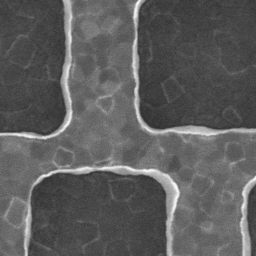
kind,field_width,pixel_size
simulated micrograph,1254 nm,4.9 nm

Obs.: holes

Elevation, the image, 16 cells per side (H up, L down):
LLLLHHHHHLLLLLLL
LLLLHHHHHLLLLLLL
LLLLHHHHHLLLLLLL
LLLLHHHHHLLLLLLL
LLLLHHHHHLLLLLLL
LLLLHHHHHLLLLLLL
LLLLHHHHHLLLLLLL
LLLLHHHHHLLLLLLL
HHHHHHHHHHHHHHHH
HHHHHHHHHHHHHHHH
HHHHHHHHHHHHHHHH
HHLLLLLLLLHHHHHH
HHLLLLLLLLLHHHHL
HHLLLLLLLLLHHHHL
HHLLLLLLLLHHHHHL
HHLLLLLLLLHHHHHH